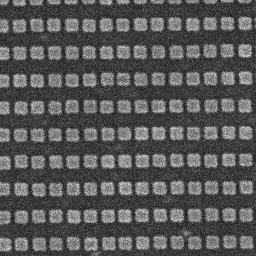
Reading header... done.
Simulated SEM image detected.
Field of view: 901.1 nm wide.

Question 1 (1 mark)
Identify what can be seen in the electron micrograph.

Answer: a regular array of raised bodies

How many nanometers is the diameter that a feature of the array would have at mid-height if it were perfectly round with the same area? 46.5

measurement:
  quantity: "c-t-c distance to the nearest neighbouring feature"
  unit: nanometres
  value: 59.9